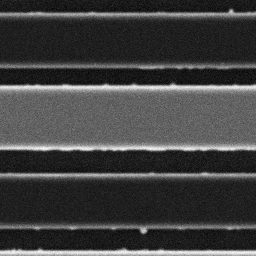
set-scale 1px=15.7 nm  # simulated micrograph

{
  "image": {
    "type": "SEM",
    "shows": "lines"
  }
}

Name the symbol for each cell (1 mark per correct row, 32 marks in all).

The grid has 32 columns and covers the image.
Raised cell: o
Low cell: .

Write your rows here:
................................
............................o...
oooooooooooooooooooooooooooooooo
oooooooooooooooooooooooooooooooo
oooooooooooooooooooooooooooooooo
oooooooooooooooooooooooooooooooo
oooooooooooooooooooooooooooooooo
oooooooooooooooooooooooooooooooo
.................oooo.oo.o.oo...
................................
................................
oooooooooooooooooooooooooooooooo
oooooooooooooooooooooooooooooooo
oooooooooooooooooooooooooooooooo
oooooooooooooooooooooooooooooooo
oooooooooooooooooooooooooooooooo
oooooooooooooooooooooooooooooooo
oooooooooooooooooooooooooooooooo
oooooooooooooooooooooooooooooooo
................................
................................
................................
oooooooooooooooooooooooooooooooo
oooooooooooooooooooooooooooooooo
oooooooooooooooooooooooooooooooo
oooooooooooooooooooooooooooooooo
oooooooooooooooooooooooooooooooo
oooooooooooooooooooooooooooooooo
....o...oo....o..oo...o.....oo..
................................
................................
ooooooooooooooooooooooooooooo..o